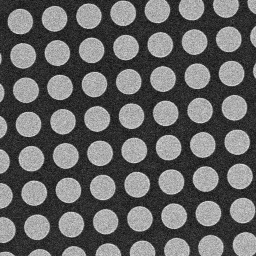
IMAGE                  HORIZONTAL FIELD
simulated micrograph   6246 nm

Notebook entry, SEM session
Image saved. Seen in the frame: an array of small figures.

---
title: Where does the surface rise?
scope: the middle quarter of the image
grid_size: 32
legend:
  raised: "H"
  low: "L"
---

LLLLLLLLLLLLLLLLLLLLLLLLLLLLLLLL
LLLLLLLLLLLLLLLHHLLLLLLHHHHLLLLH
LLLLLLHHHLLLLLHHHHHLLLHHHHHHLLHH
HLLLLHHHHHLLLHHHHHHLLLHHHHHHLLHH
HHLLLHHHHHHLLHHHHHHLLLHHHHHHLLLH
HHLLLHHHHHHLLHHHHHHLLLHHHHHLLLLH
HHLLLHHHHHLLLLHHHHLLLLLHHHLLLLLL
HHLLLLHHHHLLLLLLHLLLLLLLLLLLLLLL
HLLLLLLLLLLLLLLLLLLLLLLLLLLLLLLL
LLLLLLLLLLLLLLLLLLLLLLLLHHHLLLLL
LLLLLLLLLLLLLLLHHHHLLLLHHHHHLLLH
HLLLLLHHHHLLLLHHHHHHLLHHHHHHLLLH
HHLLLHHHHHHLLLHHHHHHLLHHHHHHHLLH
HHHLLHHHHHHLLLHHHHHHLLLHHHHHLLLL
HHHLLHHHHHHLLLHHHHHHLLLHHHHHLLLL
HHHLLLHHHHHLLLLHHHHLLLLLLLLLLLLL
HHLLLLLHHHLLLLLLLLLLLLLLLLLLLLLL
LLLLLLLLLLLLLLLLLLLLLLLLLLLLLLLL
LLLLLLLLLLLLLLLLLLLLLLLLHHHHLLLL
LLLLLLLLHHLLLLLHHHHHLLLHHHHHHLLL
HHLLLLHHHHHHLLLHHHHHHLLHHHHHHLLL
HHHLLLHHHHHHLLHHHHHHHLLHHHHHHLLL
HHHLLLHHHHHHLLLHHHHHHLLHHHHHHLLL
HHHHLLHHHHHHLLLHHHHHLLLLHHHHLLLL
HHHLLLLHHHHLLLLLHHHLLLLLLLLLLLLL
HHLLLLLLLLLLLLLLLLLLLLLLLLLLLLLL
LLLLLLLLLLLLLLLLLLLLLLLLLLLLLLLL
LLLLLLLLLLLLLLLLLHHHLLLLHHHHHLLL
LLLLLLLLHHHHLLLLHHHHHLLLHHHHHHLL
HHHLLLLHHHHHLLLHHHHHHLLLHHHHHHLL
HHHHLLLHHHHHHLLHHHHHHLLLHHHHHHLL
HHHHLLLHHHHHHLLHHHHHHLLLHHHHHLLL